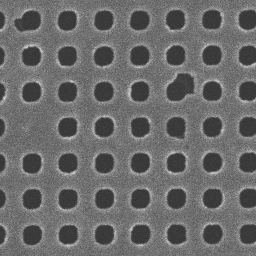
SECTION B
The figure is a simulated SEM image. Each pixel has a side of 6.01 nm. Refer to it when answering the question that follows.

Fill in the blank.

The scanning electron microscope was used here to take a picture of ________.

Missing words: a regular array of holes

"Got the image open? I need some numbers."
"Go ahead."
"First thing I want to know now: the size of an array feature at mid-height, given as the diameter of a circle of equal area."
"123 nm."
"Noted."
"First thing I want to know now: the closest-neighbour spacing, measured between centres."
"214 nm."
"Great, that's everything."